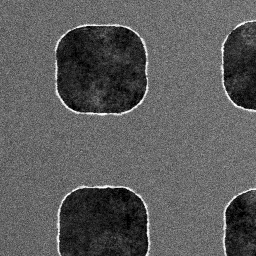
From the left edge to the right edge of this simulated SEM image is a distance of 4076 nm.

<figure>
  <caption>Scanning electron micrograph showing holes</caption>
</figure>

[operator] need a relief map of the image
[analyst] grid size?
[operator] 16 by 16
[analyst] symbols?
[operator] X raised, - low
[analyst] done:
XXXXXXXXXXXXXXXX
XXXXXXXXXXXXXXX-
XXXX-----XXXXX--
XXXX-----XXXXX--
XXXX-----XXXXX--
XXXX-----XXXXX--
XXXX-----XXXXXX-
XXXXXXXXXXXXXXXX
XXXXXXXXXXXXXXXX
XXXXXXXXXXXXXXXX
XXXXXXXXXXXXXXXX
XXXXXXXXXXXXXXXX
XXXX-----XXXXXX-
XXXX-----XXXXX--
XXXX-----XXXXX--
XXXX-----XXXXX--